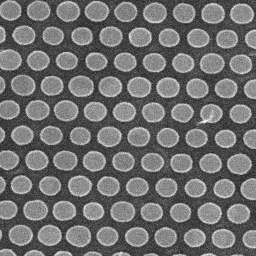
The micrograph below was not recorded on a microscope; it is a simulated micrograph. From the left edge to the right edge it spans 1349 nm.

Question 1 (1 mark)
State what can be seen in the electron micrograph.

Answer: a regular array of raised bodies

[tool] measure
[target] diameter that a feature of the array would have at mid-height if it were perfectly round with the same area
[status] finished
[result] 108 nm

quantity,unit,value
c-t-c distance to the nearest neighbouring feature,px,28.5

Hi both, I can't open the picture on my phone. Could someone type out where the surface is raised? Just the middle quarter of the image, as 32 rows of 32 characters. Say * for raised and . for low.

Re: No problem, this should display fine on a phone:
***...****...*****..*****..*****
.......**.....**.....****...****
................................
..****....***.....**............
..*****..*****..*****...****...*
.******..*****..******.******..*
.******..*****..******.******..*
..****....****...****...****...*
................................
**..............................
***...****...****...****....***.
***..******..*****..*****..*****
***..******..*****..*****..*****
***...****...****...*****...****
..............................*.
................................
..****...****....****...****....
..****...*****..*****...****...*
..****..******..*****..*****...*
..****...*****..*****...****...*
..........**.............**.....
................................
***...***....****...............
***..*****..*****...****...*****
***..*****..*****..******..*****
***..*****...****...*****..*****
*......*......**.....**.....***.
................................
..****....**....................
.******..****...*****...****...*
.******.******..*****..*****..**
..*****..*****..*****..*****..**